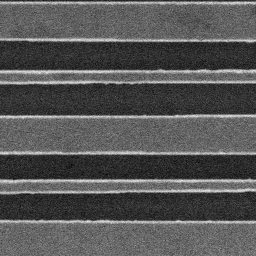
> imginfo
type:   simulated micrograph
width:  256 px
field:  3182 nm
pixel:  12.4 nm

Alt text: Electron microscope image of lines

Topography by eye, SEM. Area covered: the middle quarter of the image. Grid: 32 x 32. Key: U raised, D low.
DDDDDDDDDDDDDDDDDDDDDDDDDDDDDDDD
DDDDDDDDDDDDDDDDDDDDDDDDDDDDDDDD
UUUUUUUUUUUUUUUUUUUUUUUUUUUUUUUU
UUUUUUUUUUUUUUUUUUUUUUUUUUUUUUUU
UUUUUUUUUUUUUUUUUUUUUUUUUUUUUUUU
DDDDDDDDDDDDDDDDDDDDDDDDDDDDDDDD
DDDDDDDDDDDDDDDDDDDDDDDDDDDDDDDD
DDDDDDDDDDDDDDDDDDDDDDDDDDDDDDDD
DDDDDDDDDDDDDDDDDDDDDDDDDDDDDDDD
DDDDDDDDDDDDDDDDDDDDDDDDDDDDDDDD
DDDDDDDDDDDDDDDDDDDDDDDDDDDDDDDD
DDDDDDDDDDDDDDDDDDDDDDDDDDDDDDDD
DDDDDDDDDDDDDDDDDDDDDDDDDDDDDDDD
UUUUUUUUUUUUUUUUUUUUUUUUUUUUUUUU
UUUUUUUUUUUUUUUUUUUUUUUUUUUUUUUU
UUUUUUUUUUUUUUUUUUUUUUUUUUUUUUUU
UUUUUUUUUUUUUUUUUUUUUUUUUUUUUUUU
UUUUUUUUUUUUUUUUUUUUUUUUUUUUUUUU
UUUUUUUUUUUUUUUUUUUUUUUUUUUUUUUU
UUUUUUUUUUUUUUUUUUUUUUUUUUUUUUUU
UUUUUUUUUUUUUUUUUUUUUUUUUUUUUUUU
UUUUUUUUUUUUUUUUUUUUUUUUUUUUUUUU
DDDDDDDDDDDDDDDDDDDDDDDDDDDDUDUU
DDDDDDDDDDDDDDDDDDDDDDDDDDDDDDDD
DDDDDDDDDDDDDDDDDDDDDDDDDDDDDDDD
DDDDDDDDDDDDDDDDDDDDDDDDDDDDDDDD
DDDDDDDDDDDDDDDDDDDDDDDDDDDDDDDD
DDDDDDDDDDDDDDDDDDDDDDDDDDDDDDDD
DDDDDDDDDDDDDDDDDDDDDDDDDDDDDDDD
UUUUUUUUUUUUUUUUUUUUUUUUUUUUUUUU
UUUUUUUUUUUUUUUUUUUUUUUUUUUUUUUU
UUUUUUUUUUUUUUUUUUUUUUUUUUUUUUUU